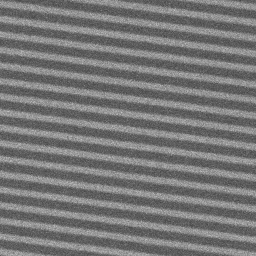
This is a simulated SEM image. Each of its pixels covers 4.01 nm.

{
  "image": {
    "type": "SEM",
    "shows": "parallel lines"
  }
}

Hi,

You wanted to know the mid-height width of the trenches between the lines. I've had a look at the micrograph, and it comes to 39.2 nm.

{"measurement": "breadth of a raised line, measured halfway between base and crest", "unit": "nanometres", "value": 21.3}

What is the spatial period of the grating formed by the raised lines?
15.4 px